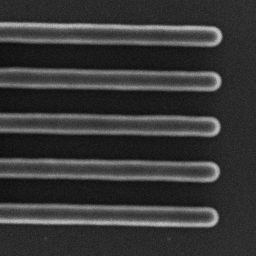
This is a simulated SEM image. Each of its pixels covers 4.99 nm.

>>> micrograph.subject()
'groups of lines, slits or small figures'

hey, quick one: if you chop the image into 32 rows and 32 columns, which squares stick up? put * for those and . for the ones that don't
................................
................................
................................
*********************...........
***************************.....
....................*******.....
................................
................................
................................
***************************.....
***************************.....
................................
................................
................................
************....................
***************************.....
.......********************.....
................................
................................
................................
***********************.**......
***************************.....
................................
................................
................................
................................
***************************.....
***************************.....
................................
................................
................................
................................